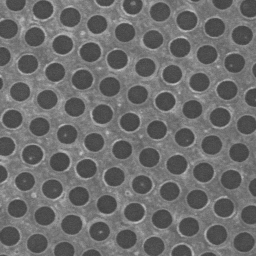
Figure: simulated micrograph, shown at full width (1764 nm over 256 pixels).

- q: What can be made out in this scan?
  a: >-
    a regular array of holes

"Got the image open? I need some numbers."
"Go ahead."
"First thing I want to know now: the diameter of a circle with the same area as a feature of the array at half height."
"138 nm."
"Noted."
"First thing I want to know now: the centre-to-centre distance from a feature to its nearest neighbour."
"193 nm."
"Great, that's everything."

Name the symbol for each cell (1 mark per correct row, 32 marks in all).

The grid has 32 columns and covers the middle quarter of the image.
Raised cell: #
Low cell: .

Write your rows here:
###########....###.....###..####
####..############.....##....###
##.....###########....###.....##
##.....###...############....##.
##.....##.....############..###.
###....##.....###..#############
#########.....##.....###########
##########...###.....###...#####
##.#############.....##.....####
#....############...###.....###.
.....###...############.....##..
.....##.....############..####..
#....##.....###...############..
#######.....##.....############.
########...###.....###...#######
..############.....##....#######
...############...###.....###...
...###...############.....##....
...##.....############...###....
..###.....###...############....
#####.....##.....############..#
######...###.....###...#########
.###########.....##.....########
.############...###.....##....##
.###....###########.....##.....#
.##.....############...###.....#
###.....###...############....##
###.....##.....############..###
#####.####.....###...###########
##########.....##.....####.#####
###########...###.....##.....###
##....###########.....##.....###